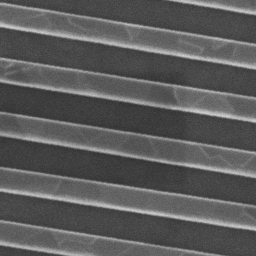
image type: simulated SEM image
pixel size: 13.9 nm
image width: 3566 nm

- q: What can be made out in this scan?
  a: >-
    lines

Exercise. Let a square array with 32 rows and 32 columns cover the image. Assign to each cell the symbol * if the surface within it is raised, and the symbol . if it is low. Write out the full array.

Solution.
*.......................********
*******.......................**
*************...................
.*******************............
.......*******************......
..............*****************.
...................*************
**.......................*******
********........................
***************.................
..*******************...........
........*******************.....
...............*****************
.....................***********
***........................*****
**********......................
****************................
...*******************..........
..........******************....
................****************
.....................***********
****........................****
***********.....................
*****************...............
....********************........
...........********************.
.................***************
.......................*********
******........................**
************....................
******************..............
......*******************.......